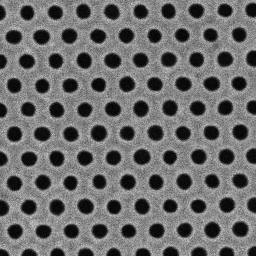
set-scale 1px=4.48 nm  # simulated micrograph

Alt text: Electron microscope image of a regular array of holes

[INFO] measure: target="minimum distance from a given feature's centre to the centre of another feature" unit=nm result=124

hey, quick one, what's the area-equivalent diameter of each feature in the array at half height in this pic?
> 0.0631 um